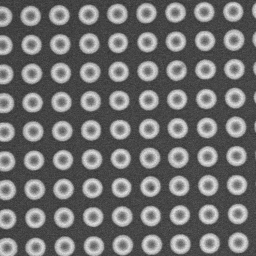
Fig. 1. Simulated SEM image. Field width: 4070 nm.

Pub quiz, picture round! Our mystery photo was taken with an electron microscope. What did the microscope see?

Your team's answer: an array of small figures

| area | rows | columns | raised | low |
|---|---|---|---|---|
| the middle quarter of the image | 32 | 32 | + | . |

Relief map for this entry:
+....+++....++++...++++...++++..
++..+++++..+++++..+++++...++++..
++..+++++..+++++...++++...++++..
+...++++....++++...++++....+++..
......+.........................
................................
................................
+....+++....++++...++++...++++..
++..+++++..+++++...++++...+++++.
++..+++++..+++++...++++...+++++.
++..+++++...++++...++++...++++..
+....+++........................
................................
................................
.....+++....++++....+++...++++..
++...++++...++++...+++++..+++++.
++..+++++...++++...+++++..+++++.
++..+++++...++++...++++...++++..
+....+++.....++.....++......+...
................................
................................
......++.....++.....+++....+++..
++...++++...++++...+++++..+++++.
++...++++...+++++..+++++..+++++.
++...++++...++++...+++++..+++++.
++...++++....+++....+++....+++..
................................
................................
....................+++....+++..
++...++++...++++...+++++..+++++.
++...++++...+++++..+++++..+++++.
++...++++...+++++..+++++...++++.